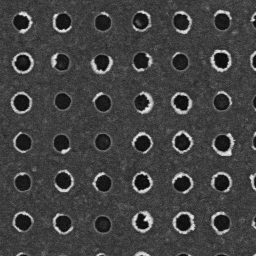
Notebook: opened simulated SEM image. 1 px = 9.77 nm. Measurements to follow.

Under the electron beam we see a regular array of holes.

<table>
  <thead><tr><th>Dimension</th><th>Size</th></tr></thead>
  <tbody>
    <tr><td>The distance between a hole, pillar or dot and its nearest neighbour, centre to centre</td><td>380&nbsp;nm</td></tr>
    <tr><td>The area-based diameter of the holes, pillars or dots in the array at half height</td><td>160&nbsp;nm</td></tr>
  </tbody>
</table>